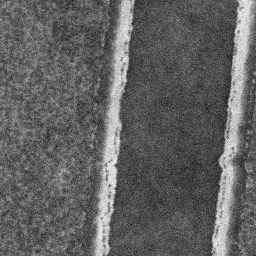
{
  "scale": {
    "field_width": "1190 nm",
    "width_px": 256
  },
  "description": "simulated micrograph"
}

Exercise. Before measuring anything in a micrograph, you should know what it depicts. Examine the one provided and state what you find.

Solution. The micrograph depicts one or a few lines or trenches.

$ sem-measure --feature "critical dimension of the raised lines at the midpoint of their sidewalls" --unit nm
564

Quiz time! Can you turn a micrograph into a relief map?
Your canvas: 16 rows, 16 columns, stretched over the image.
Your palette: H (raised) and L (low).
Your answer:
LLLLLLLLHHHHHHHL
LLLLLLLLHHHHHHHL
LLLLLLLLHHHHHHHL
LLLLLLLHHHHHHHHL
LLLLLLLHHHHHHHHL
LLLLLLLHHHHHHHHL
LLLLLLLHHHHHHHHL
LLLLLLLHHHHHHHHL
LLLLLLLHHHHHHHHL
LLLLLLLHHHHHHHHL
LLLLLLLHHHHHHHLL
LLLLLLLHHHHHHHLL
LLLLLLLHHHHHHHLL
LLLLLLHHHHHHHHLL
LLLLLLHHHHHHHHLL
LLLLLLHHHHHHHHLL